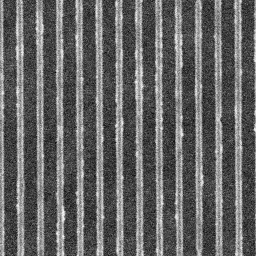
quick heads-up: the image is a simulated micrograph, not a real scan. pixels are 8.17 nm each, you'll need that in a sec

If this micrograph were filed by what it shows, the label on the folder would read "parallel lines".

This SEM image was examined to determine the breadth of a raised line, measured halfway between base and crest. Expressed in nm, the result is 44.9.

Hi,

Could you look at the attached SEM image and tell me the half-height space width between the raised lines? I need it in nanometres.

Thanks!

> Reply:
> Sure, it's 117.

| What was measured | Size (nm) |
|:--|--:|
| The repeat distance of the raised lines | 162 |